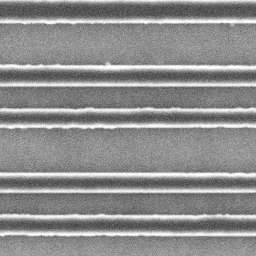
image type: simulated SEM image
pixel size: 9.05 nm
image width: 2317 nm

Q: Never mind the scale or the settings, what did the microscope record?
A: lines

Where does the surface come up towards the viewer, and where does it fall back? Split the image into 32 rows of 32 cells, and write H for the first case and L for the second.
HHHHHHHHHHHHHHHHHHHHHHHHHHHHHHHH
HHHHHHHHHHHHHHHHHHHHHHHHHHHHHHHH
HHHHHHHHHHHHHHHHHHHHHHHHHHHHHHHH
LLLLLLLLLLLLLLLLLLLLLLLLLLLLLLLL
LLLLLLLLLLLLLLLLLLLLLLLLLLLLLLLL
LLLLLLLLLLLLLLLLLLLLLLLLLLLLLLLL
LLLLLLLLLLLLLLLLLLLLLLLLLLLLLLLL
LLLLLLLLLLLLLLLLLLLLLLLLLLLLLLLL
HHHHHHHHHHHHHHHHHHHHHHHHHHHHHHHH
HHHHHHHHHHHHHHHHHHHHHHHHHHHHHHHH
HHHHHHHHHHHHHHHHHHHHHHHHHHHHHHHH
LLLLLLLLLLLLLLLLLLLLLLLLLLLLLLLL
LLLLLLLLLLLLLLLLLLLLLLLLLLLLLLLL
LLLLLLLLLLLLLLLLLLLLLLLLLLLLLLLL
HHHHHHHHHHHHHHHHHHHHHHHHHHHHHHHH
HHHHHHHHHHHHHHHHHHHHHHHHHHHHHHHH
LLLLLLLLLLLLLLLLLLLLLLLLLLLLLLLL
LLLLLLLLLLLLLLLLLLLLLLLLLLLLLLLL
LLLLLLLLLLLLLLLLLLLLLLLLLLLLLLLL
LLLLLLLLLLLLLLLLLLLLLLLLLLLLLLLL
LLLLLLLLLLLLLLLLLLLLLLLLLLLLLLLL
LLLLLLLLLLLLLLLLLLLLLLLLLLLLLLLL
HHHHHHHHHHHHHHHHHHHHHHHHHHHHHHHH
HHHHHHHHHHHHHHHHHHHHHHHHHHHHHHHH
LLLLLLLLLLLLLLLLLLLLLLLLLLLLLLLL
LLLLLLLLLLLLLLLLLLLLLLLLLLLLLLLL
LLLLLLLLLLLLLLLLLLLLLLLLLLLLLLLL
HHHHHHHHHHHHHHHHHHHHHHHHHHHHHHHH
HHHHHHHHHHHHHHHHHHHHHHHHHHHHHHHH
LLLLLLLLLLLLLLLLLLLLLLLLLLLLLLLL
LLLLLLLLLLLLLLLLLLLLLLLLLLLLLLLL
LLLLLLLLLLLLLLLLLLLLLLLLLLLLLLLL